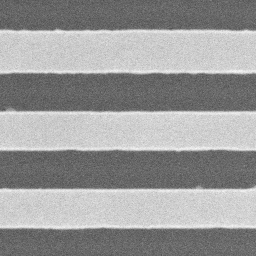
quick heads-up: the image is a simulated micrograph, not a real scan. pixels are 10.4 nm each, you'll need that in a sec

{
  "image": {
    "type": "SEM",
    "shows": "lines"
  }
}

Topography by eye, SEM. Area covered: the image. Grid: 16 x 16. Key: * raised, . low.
................
................
****************
****************
****************
................
................
****************
****************
................
................
................
****************
****************
................
................